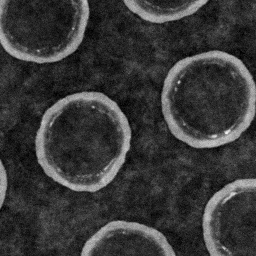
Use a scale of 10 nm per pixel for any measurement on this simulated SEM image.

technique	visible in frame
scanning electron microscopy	raised bodies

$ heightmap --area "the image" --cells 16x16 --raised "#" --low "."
#####...####....
#####...........
#####...........
.###.........#..
...........####.
..........######
....###...######
...#####...####.
...#####...###..
...#####........
...####.........
....##.........#
..............##
.............###
......###....###
.....#####...###